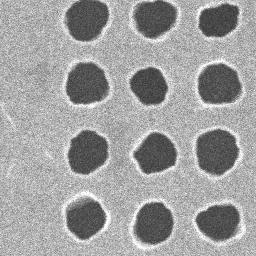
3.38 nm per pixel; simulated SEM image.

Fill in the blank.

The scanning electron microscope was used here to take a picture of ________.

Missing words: a regular array of holes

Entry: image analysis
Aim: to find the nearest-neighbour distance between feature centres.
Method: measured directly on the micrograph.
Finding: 218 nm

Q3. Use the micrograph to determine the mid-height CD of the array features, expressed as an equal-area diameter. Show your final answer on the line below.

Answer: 138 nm